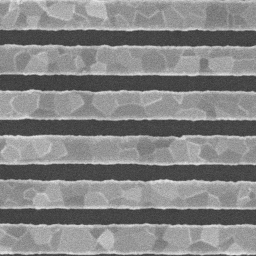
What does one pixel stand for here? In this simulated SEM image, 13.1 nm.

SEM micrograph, lines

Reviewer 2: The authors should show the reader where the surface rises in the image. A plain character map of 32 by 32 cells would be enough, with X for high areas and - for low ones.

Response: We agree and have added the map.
XXXXXXXXXXXXXXXXXXXXXXXXXXXXXXXX
XXXXXXXXXXXXXXXXXXXXXXXXXXXXXXXX
XXXXXXXXXXXXXXXXXXXXXXXXXXXXXXXX
XXXXXXXXXXXXXXXXXXXXXXXXXXXXXXXX
--------------------------------
--------------------------------
XXXXXXXXXXXXXXXXXXXXXXXXXXXXXXXX
XXXXXXXXXXXXXXXXXXXXXXXXXXXXXXXX
XXXXXXXXXXXXXXXXXXXXXXXXXXXXXXXX
--------------------------------
--------------------------------
XXXXXXXXXXX--XXXXXXXXX--XXXXXXX-
XXXXXXXXXXXXXXXXXXXXXXXXXXXXXXXX
XXXXXXXXXXXXXXXXXXXXXXXXXXXXXXXX
XXXXXXXXXXXXXXXXXXXXXXXXXXXXXXXX
--------------------------------
--------------------------------
XXXXXXXXXXXXXXXXXXXXXXXXXXXXXXXX
XXXXXXXXXXXXXXXXXXXXXXXXXXXXXXXX
XXXXXXXXXXXXXXXXXXXXXXXXXXXXXXXX
-------------------XXX------XX-X
--------------------------------
XX------------------------------
XXXXXXXXXXXXXXXXXXXXXXXXXXXXXXXX
XXXXXXXXXXXXXXXXXXXXXXXXXXXXXXXX
XXXXXXXXXXXXXXXXXXXXXXXXXXXXXXXX
--------------------------------
--------------------------------
XXXXXXXXXXXXXXXXXXXXXXXXXXXXXXXX
XXXXXXXXXXXXXXXXXXXXXXXXXXXXXXXX
XXXXXXXXXXXXXXXXXXXXXXXXXXXXXXXX
XXXXXXXXXXXXXXXXXXXXXXXXXXXXXXXX